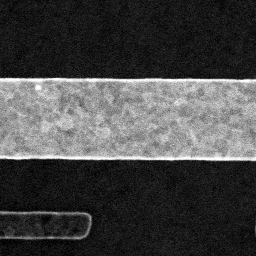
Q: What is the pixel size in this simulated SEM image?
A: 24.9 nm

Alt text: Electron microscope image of wiring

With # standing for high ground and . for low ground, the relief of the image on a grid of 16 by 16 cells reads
................
................
................
................
................
################
################
################
################
################
................
................
................
#####...........
#####...........
................